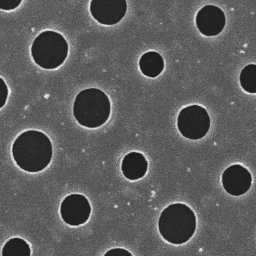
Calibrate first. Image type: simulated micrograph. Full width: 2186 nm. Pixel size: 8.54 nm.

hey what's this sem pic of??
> a regular array of holes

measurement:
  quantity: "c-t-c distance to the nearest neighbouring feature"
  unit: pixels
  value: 71.9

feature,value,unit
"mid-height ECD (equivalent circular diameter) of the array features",276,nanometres